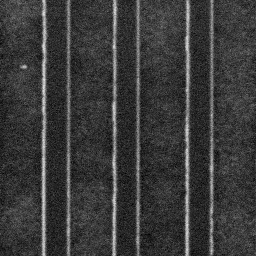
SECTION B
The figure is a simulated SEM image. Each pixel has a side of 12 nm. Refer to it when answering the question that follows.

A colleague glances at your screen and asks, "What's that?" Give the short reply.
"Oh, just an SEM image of lines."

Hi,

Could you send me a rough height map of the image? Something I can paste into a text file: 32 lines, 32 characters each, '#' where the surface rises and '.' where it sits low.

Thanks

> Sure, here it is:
......###.....###......###......
......###.....###......###......
......###.....###......###......
......###.....###......###......
......###.....###......###......
......###.....###......###......
......###.....###......###......
......###.....###......###......
......###.....###......###......
......###.....###......###......
......###.....###......###......
.....####.....###......###......
......###.....###......###......
.....####.....###......###......
......###.....###......###......
......###.....###......###......
.....####.....###......###......
.....####.....###......###......
.....####.....###......###......
.....####.....###......###......
.....####.....###......###......
.....####.....###......###......
.....####.....###......###......
.....####.....###......###......
.....####.....###......###......
.....####.....###......###......
.....####.....###......###......
.....####.....###......###......
.....####.....###......###......
.....####.....###......###......
.....####.....###......###......
.....####.....###......###......